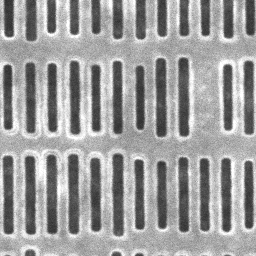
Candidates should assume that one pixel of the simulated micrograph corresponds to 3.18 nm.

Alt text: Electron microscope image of a regular array of holes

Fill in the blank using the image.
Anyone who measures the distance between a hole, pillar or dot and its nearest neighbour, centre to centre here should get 68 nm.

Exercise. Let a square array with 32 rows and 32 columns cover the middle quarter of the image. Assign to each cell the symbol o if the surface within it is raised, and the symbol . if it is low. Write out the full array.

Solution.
o...ooo..ooo...ooo..ooo...oo...o
o...ooo..ooo...ooo..ooo...oo...o
o...ooo..ooo...ooo..ooo...oo...o
o...ooo..ooo...ooo..ooo...oo...o
o...ooo..ooo...ooo..ooo...ooo..o
o...ooo..ooo...ooo..ooo...ooo..o
o...ooo..ooo...ooo..ooo...ooo..o
o...ooo..ooo...ooo..ooo...ooo..o
o...ooo..ooo...ooo..ooo...ooo..o
o...ooo..ooo...ooo..ooo...ooo..o
o...ooo..ooo...ooo..ooo...ooo..o
o...ooo..ooo...ooo..ooo...ooo..o
o...ooo..ooo...ooo..ooo...ooo..o
o...ooo..ooo...ooo..ooo...ooo..o
o...ooo..ooo...ooo..ooo...ooo..o
o...ooo..ooo...ooo..ooo...ooo..o
o...ooo..ooo...oooo.ooo...ooo...
oo..ooooooooo.ooooooooo...ooo..o
oooooooooooooooooooooooo.ooooooo
oooooooooooooooooooooooooooooooo
oooooooooooooooooooooooooooooooo
oooooooooooooooooooooooooooooooo
oo.oooooooooo.oooooooooooooooooo
o...ooo..ooo...oooooooooooooo..o
o...oo...ooo...ooo..ooo..oooo..o
o...oo...ooo...ooo..ooo...ooo..o
o...oo...ooo...ooo..ooo...ooo..o
o...oo...ooo...ooo..ooo...ooo..o
o...oo...ooo...ooo..ooo...ooo..o
o...oo...ooo...ooo..ooo...ooo..o
o...oo...ooo...ooo..ooo...ooo..o
o...oo...ooo...ooo..ooo...oo...o